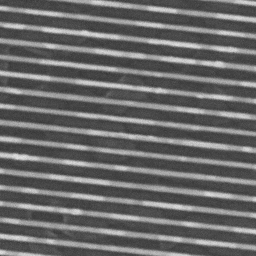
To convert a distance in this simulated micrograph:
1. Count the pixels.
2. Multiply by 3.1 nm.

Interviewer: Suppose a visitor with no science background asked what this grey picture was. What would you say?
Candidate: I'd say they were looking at parallel lines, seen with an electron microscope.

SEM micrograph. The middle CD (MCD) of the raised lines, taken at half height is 11.2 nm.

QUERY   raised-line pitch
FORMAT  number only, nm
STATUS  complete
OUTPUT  50.1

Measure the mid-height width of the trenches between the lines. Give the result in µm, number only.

0.0385